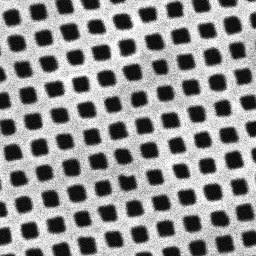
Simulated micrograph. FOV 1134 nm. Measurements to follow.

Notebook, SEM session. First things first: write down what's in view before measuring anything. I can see a regular array of holes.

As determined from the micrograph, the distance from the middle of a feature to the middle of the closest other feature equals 115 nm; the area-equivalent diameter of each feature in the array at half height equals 0.0786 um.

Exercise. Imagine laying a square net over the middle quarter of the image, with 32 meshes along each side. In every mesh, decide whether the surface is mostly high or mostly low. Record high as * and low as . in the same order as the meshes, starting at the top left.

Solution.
***************....***....***...
***************....***....***.**
********.....**.....***..*******
***...***....**....*************
**....***....*****************..
**....***.*.************...***..
***...*****************....***..
*****************...***....***..
***********...***....***...*****
*****..***....***....***********
***.....**....***...************
.**.....***...*****************.
.***....*****************...***.
.******************..***.....***
.*****************....***....***
***********....***....***....***
*****....**....***....**********
*****....**.....***.************
..***....***...************...**
..***....*****************....**
..*****************....***....**
*************...***.....**....**
********..***....**.....****.***
******.....**....***...*********
....**.....**....***************
....***....****************....*
....*****************...***....*
....****************....****...*
**************....***....***...*
********...***....***....*******
**...***....**....**************
*....***....***..*************..